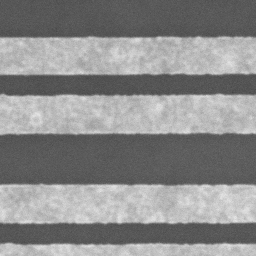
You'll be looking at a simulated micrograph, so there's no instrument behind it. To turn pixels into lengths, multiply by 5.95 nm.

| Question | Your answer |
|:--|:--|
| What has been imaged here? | lines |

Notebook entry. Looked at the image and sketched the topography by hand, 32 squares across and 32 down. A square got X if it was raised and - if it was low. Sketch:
--------------------------------
--------------------------------
--------------------------------
--------------------------------
--------------------------------
XXXXXXXXXXXXXXXXXXXXXXXXXXXXXXXX
XXXXXXXXXXXXXXXXXXXXXXXXXXXXXXXX
XXXXXXXXXXXXXXXXXXXXXXXXXXXXXXXX
XXXXXXXXXXXXXXXXXXXXXXXXXXXXXXXX
--------------------------------
--------------------------------
--------------------------------
XXXXXXXXXXXXXXXXXXXXXXXXXXXXXXXX
XXXXXXXXXXXXXXXXXXXXXXXXXXXXXXXX
XXXXXXXXXXXXXXXXXXXXXXXXXXXXXXXX
XXXXXXXXXXXXXXXXXXXXXXXXXXXXXXXX
XXXXXXXXXXXXXXXXXXXXXXXXXXXXXXXX
--------------------------------
--------------------------------
--------------------------------
--------------------------------
--------------------------------
--------------------------------
XXXXXXXXXXXXXXXXXXXXXXXXXXXXXXXX
XXXXXXXXXXXXXXXXXXXXXXXXXXXXXXXX
XXXXXXXXXXXXXXXXXXXXXXXXXXXXXXXX
XXXXXXXXXXXXXXXXXXXXXXXXXXXXXXXX
XXXXXXXXXXXXXXXXXXXXXXXXXXXXXXXX
--------------------------------
--------------------------------
XX----------------XX--------X---
XXXXXXXXXXXXXXXXXXXXXXXXXXXXXXXX